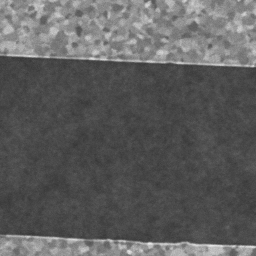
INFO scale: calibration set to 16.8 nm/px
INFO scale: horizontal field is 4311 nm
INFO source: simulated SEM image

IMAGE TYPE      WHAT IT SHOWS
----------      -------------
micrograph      one or a few lines or trenches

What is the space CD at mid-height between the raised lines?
3.04 micrometres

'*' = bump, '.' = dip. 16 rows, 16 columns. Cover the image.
****************
****************
****************
..**************
................
................
................
................
................
................
................
................
................
................
................
****************